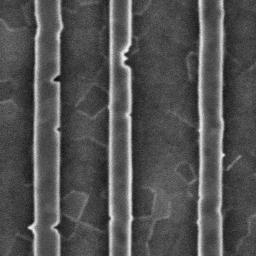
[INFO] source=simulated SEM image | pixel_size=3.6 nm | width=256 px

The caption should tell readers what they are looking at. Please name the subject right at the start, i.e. one or a few lines or trenches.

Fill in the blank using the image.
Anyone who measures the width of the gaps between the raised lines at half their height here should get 226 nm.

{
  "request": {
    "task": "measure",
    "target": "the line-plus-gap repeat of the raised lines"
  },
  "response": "0.295 micrometres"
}